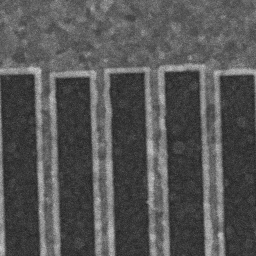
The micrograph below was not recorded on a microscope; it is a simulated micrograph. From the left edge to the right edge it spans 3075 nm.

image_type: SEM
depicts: parallel lines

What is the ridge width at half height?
174 nanometres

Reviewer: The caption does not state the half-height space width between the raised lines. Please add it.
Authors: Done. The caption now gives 491 nm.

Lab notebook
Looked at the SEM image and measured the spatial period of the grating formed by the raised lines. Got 658 nm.